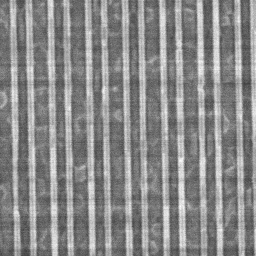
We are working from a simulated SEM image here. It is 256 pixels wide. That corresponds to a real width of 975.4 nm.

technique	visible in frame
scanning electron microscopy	parallel lines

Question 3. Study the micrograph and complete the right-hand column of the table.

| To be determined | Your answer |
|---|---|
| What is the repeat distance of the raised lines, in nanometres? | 71.2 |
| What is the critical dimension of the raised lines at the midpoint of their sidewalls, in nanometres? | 21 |